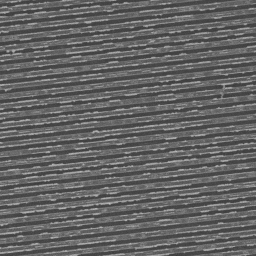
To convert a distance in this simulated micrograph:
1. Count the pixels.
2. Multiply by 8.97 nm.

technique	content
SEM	parallel lines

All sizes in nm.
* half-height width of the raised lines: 53.5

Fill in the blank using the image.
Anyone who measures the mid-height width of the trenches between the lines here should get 31.2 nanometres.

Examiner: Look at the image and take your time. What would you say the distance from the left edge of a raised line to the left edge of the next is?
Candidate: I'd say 85.8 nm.